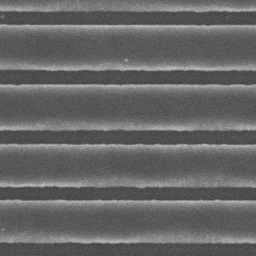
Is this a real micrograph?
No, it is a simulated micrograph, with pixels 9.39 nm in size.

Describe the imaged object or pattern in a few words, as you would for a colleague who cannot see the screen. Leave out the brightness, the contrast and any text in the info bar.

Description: lines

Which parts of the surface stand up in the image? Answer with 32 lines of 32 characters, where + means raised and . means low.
++++++++++++++++++++++++++++++++
................................
................................
++++++++++++++++++++++++++++++++
++++++++++++++++++++++++++++++++
++++++++++++++++++++++++++++++++
++++++++++++++++++++++++++++++++
++++++++++++++++++++++++++++++++
....++++++++++++++++++++++++++++
................................
................................
++++++++++++++++++++++++++++++++
++++++++++++++++++++++++++++++++
++++++++++++++++++++++++++++++++
++++++++++++++++++++++++++++++++
++++++++++++++++++++++++++++++++
................................
................................
++++++++++++++++++++++++++++++++
++++++++++++++++++++++++++++++++
++++++++++++++++++++++++++++++++
++++++++++++++++++++++++++++++++
++++++++++++++++++++++++++++++++
................................
................................
++++++++++++++++++++++++++++++++
++++++++++++++++++++++++++++++++
++++++++++++++++++++++++++++++++
++++++++++++++++++++++++++++++++
++++++++++++++++++++++++++++++++
................................
................................